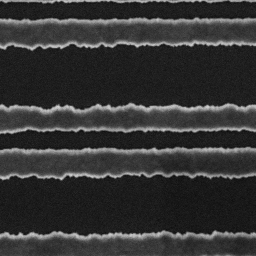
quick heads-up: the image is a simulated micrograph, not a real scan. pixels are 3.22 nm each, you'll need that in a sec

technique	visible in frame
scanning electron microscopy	lines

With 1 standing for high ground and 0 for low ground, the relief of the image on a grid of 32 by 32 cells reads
00000000000000000000000000000000
00000000000000000000000000000000
00000010100000001111000011010111
11111111111111111111111111111111
11111111111111111111111111111111
11111111111111111111111111111111
00000000000000000000000000000000
00000000000000000000000000000000
00000000000000000000000000000000
00000000000000000000000000000000
00000000000000000000000000000000
00000000000000000000000000000000
00000000000000000000000000000000
11111001100111111111111011111111
11111111111111111111111111111111
11111111111111111111111111111111
11000000000000000000000000000000
00000000000000000000000000000000
00000000000000000000000000000000
11111111111111111111111111111111
11111111111111111111111111111111
11111111111111111111111111111111
00000000000000000000000000000000
00000000000000000000000000000000
00000000000000000000000000000000
00000000000000000000000000000000
00000000000000000000000000000000
00000000000000000000000000000000
00000000000000000000000000000000
11111111110111111111111111111111
11111111111111111111111111111111
11111111111111111111111111111111